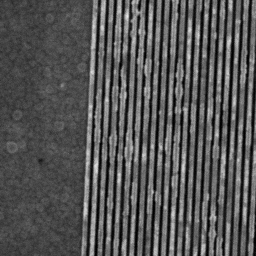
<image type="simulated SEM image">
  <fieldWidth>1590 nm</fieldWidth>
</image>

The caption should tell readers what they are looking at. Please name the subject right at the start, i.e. parallel lines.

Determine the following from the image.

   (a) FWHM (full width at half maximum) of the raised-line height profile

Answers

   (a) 4.12 pixels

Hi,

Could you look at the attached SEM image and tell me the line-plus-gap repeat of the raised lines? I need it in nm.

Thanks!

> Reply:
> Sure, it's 49.2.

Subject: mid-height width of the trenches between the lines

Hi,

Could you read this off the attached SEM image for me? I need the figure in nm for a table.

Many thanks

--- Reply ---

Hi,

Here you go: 25.6